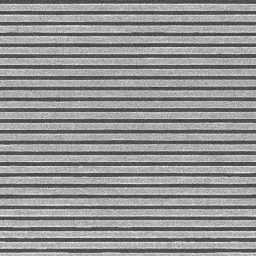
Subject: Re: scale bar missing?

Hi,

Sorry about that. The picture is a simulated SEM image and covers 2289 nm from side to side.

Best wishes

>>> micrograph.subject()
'parallel lines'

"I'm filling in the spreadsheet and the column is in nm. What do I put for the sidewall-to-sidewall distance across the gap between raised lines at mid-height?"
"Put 40.2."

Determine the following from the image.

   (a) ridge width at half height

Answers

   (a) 56.4 nanometers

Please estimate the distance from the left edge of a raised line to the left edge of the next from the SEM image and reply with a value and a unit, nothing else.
10.8 pixels